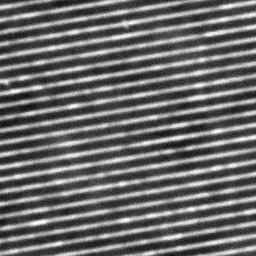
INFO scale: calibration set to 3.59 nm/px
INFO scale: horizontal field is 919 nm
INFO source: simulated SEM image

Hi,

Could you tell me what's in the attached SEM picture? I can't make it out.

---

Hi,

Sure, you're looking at parallel lines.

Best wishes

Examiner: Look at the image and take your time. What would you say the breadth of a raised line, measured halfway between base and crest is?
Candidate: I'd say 2.45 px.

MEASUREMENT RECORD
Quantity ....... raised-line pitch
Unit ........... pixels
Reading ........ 12.1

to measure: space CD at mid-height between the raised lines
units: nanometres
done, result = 35.4